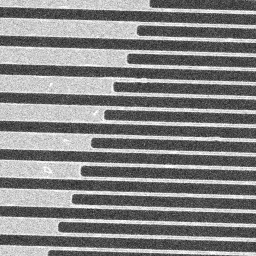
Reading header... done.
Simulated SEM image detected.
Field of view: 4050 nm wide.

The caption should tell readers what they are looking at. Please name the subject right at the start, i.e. parallel lines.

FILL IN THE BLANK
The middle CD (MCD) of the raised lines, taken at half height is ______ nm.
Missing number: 45.5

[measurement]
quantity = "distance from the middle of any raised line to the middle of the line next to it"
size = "225 nanometers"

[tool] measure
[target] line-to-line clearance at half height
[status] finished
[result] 178 nm